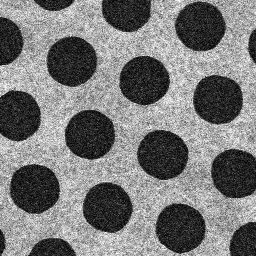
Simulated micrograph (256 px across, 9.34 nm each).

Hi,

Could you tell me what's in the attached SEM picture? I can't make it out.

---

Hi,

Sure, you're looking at a regular array of holes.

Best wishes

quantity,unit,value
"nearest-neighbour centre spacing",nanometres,703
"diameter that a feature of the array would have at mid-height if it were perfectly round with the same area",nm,462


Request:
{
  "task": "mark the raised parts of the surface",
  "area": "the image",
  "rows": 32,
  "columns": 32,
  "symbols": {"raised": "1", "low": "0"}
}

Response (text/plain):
11111000011110000001111100111111
11111111111110000001111000011111
01111111111110000011110000001111
00111111111111000011110000001111
00011111111111111111110000001110
00011110000111111111111000011110
00011100000011111111111111111110
00111100000011110000111111111111
11111100000011100000011111111111
11111100000011100000011111001111
11111111001111100000011110000011
10011111111111100000011100000011
00001111111111110000111100000011
00000111111111111111111100000011
00000111100001111111111110000011
00000111100000111111111111111111
00001111000000111110011111111111
10011111000000111100000111111111
11111111100000111000000111111111
11111111110001111000000011100000
11111111111111111000000111100000
11000001111111111100000111000000
10000001111111111111111111100000
10000001111100011111111111100000
10000001111000001111111111110001
11000001110000001111110111111111
11100111110000000111000001111111
11111111111000001111000001111111
11111111111100011110000000111100
01111111111111111111000000111000
01111000011111111111000001111000
11110000011111111111110111111000